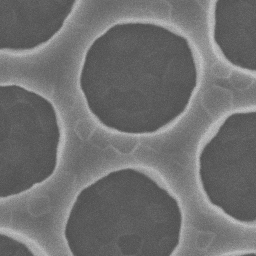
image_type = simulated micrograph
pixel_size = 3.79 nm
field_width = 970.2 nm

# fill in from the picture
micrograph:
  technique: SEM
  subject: holes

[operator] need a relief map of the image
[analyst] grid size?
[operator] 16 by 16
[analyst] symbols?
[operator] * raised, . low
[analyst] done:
.....********...
....***...***...
...***......*...
*****.......**..
*****.......****
.****.......****
...**.......****
....**.....***..
....*********...
....*********...
...*****.***....
..****....***...
*****......**...
****.......***..
****.......*****
..**.......*****